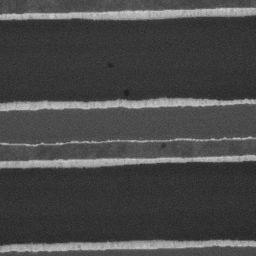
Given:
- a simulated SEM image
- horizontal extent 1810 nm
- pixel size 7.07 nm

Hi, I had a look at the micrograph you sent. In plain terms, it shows lines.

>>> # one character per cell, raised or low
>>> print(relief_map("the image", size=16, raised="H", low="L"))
HHHHHHHHHHHHHHHH
LLLLLLLLLLLLLLLL
LLLLLLLLLLLLLLLL
LLLLLLLLLLLLLLLL
LLLLLLLLLLLLLLLL
LLLLLLLLLLLLLLLL
LLLLLLLLLLHHHHHH
HHHHHHHHHHHHHHHH
HHHHHHHHHHHHHHHH
HHHHHHHHHHHHHHHH
LLLLLLLLLLLLLLLL
LLLLLLLLLLLLLLLL
LLLLLLLLLLLLLLLL
LLLLLLLLLLLLLLLL
LLLLLLLLLLLLLLLL
LLLLLLHHHHHHHHHH